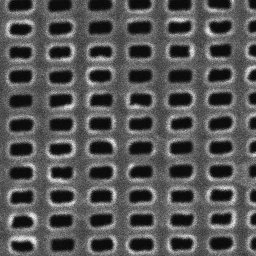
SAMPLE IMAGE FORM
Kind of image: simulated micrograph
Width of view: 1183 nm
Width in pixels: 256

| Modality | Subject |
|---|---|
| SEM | a regular array of holes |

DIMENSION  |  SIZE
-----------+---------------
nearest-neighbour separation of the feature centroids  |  0.11 um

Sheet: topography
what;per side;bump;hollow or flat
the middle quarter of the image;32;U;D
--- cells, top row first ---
UUUUUUUUUUUUUUUUUUUUUUUUUUUUUUUU
UUUUUUUUDDDUUUUUUDDDDDUUUUUUUDDU
DDUUUUDDDDDDUUUUDDDDDDUUUUDDDDDD
DDUUUUDDDDDDUUUUDDDDDDUUUUDDDDDD
DUUUUUUDDDUUUUUUUDDDUUUUUUUDDDDU
UUUUUUUUUUUUUUUUUUUUUUUUUUUUUUUU
UUUUUUUUUUUUUUUUUUUUUUUUUUUUUUUU
DUUUUUUUUUDUUUUUUDDDDUUUUUUDDDDD
DDUUUUUDDDDDUUUUDDDDDDUUUUDDDDDD
DDUUUUUDDDDDUUUUDDDDDDUUUUDDDDDD
UUUUUUUDDDDDUUUUUUUUDUUUUUUDDDDU
UUUUUUUUUUUUUUUUUUUUUUUUUUUUUUUU
UUUUUUUUUUUUUUUUUUUUUUUUUUUUUUUU
DUUUUUUDDDUDUUUUUDDDDDUUUUUUUDDD
DDUUUUDDDDDDUUUUDDDDDDUUUUUDDDDD
DDUUUUDDDDDDUUUUDDDDDDUUUUUDDDDD
DUUUUUUDDDDUUUUUDDDDUUUUUUUUDUUU
UUUUUUUUUUUUUUUUUUUUUUUUUUUUUUUU
UUUUUUUUUUUUUUUUUUUUUUUUUUUUUUUU
UUUUUUUDDDDUUUUUUUDDUUUUUUUDDDDD
DDUUUUDDDDDDUUUUUDDDDDUUUUDDDDDD
DDUUUUDDDDDDUUUUDDDDDDUUUUDDDDDD
DUUUUUUDDDDUUUUUUDDDDUUUUUUDDDDU
UUUUUUUUUUUUUUUUUUUUUUUUUUUUUUUU
UUUUUUUUUUUUUUUUUUUUUUUUUUUUUUUU
UUUUUUUUUUUUUUUUUUDDDDUUUUUDDDDD
DDUUUUUDDDDDUUUUUDDDDDUUUUDDDDDD
DDUUUUDDDDDDUUUUDDDDDDUUUUDDDDDD
DDUUUUUDDDDDUUUUUDDDDUUUUUUUDUUU
UUUUUUUUUUUUUUUUUUUUUUUUUUUUUUUU
UUUUUUUUUUUUUUUUUUUUUUUUUUUUUUUU
UUUUUUUUDDDUUUUUUUUUDUUUUUUUDDDU